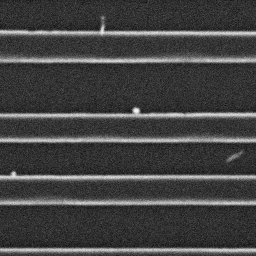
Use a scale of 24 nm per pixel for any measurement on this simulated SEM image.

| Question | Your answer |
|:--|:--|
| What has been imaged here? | lines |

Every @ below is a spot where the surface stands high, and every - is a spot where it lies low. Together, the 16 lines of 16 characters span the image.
----------------
----------------
@@@@@@@@@@@@@@@@
@@@@@@@@@@@@@@@@
----------------
----------------
----------------
@@@@@@@@@@@@@@@@
@@@@@@@@@@@@@@@@
----------------
----------------
@@@@@@@@@@@@@@@@
@@@@@@@@@@@@@@@@
----------------
----------------
----------------